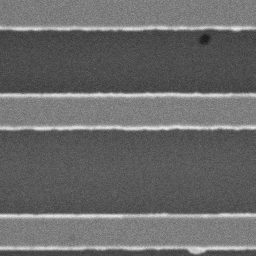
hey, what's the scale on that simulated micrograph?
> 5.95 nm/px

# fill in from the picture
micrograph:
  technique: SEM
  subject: lines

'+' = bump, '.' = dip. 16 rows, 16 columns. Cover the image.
++++++++++++++++
++++++++++++++++
................
................
................
................
++++++++++++++++
++++++++++++++++
................
................
................
................
................
++++++++++++++++
++++++++++++++++
++++++++++++++++